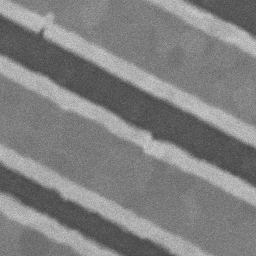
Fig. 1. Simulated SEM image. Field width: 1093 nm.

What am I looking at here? one or a few lines or trenches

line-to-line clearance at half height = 50.5 px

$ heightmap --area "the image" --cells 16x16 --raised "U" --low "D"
UUUUUUUUUUUDDDDD
DDUUUUUUUUUUUDDD
DDDDUUUUUUUUUUUD
DDDDDDUUUUUUUUUU
UDDDDDDDUUUUUUUU
UUUDDDDDDDUUUUUU
UUUUUDDDDDDDUUUU
UUUUUUUDDDDDDDUU
UUUUUUUUUDDDDDDD
UUUUUUUUUUUDDDDD
DDUUUUUUUUUUDDDD
DDDDUUUUUUUUUUUD
DDDDDUUUUUUUUUUU
UUDDDDDUUUUUUUUU
UUUUDDDDDUUUUUUU
UUUUUUDDDDDUUUUU